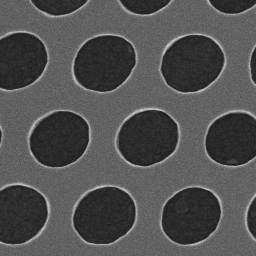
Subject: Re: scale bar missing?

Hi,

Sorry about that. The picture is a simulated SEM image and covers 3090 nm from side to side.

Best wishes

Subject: holes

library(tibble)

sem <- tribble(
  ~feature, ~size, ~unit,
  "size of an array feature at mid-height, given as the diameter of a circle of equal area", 711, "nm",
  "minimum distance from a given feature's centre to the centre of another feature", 1040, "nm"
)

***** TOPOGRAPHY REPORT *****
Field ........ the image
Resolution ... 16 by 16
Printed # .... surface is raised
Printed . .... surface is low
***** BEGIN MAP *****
##...###..###...
################
..####..###..###
...##...##....##
...##...##....##
.####..####..###
################
###..###...###..
##....#....##...
##...##....##...
################
################
...##...###...##
...##...##....#.
..###...##...###
################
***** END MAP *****